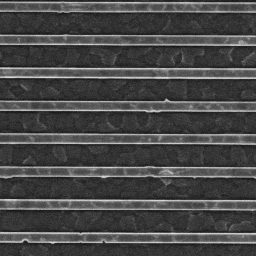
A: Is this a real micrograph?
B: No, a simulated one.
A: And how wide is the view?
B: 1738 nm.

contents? parallel lines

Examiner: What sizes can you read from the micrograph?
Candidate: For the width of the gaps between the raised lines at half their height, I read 157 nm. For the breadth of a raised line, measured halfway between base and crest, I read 63.7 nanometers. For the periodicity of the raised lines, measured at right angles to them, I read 224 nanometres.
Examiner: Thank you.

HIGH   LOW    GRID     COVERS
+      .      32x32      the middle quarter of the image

................................
++++++++++++++++++++++++++++++++
++++++++++++++++++++++++++++++++
................................
................................
................................
................................
................................
................................
+++++++++++++++++++++....++.....
++++++++++++++++++++++++++++++++
................++++++++++++++++
................................
................................
................................
................................
................................
................................
++++++++++++++++++++++++++++++++
++++++++++++++++++++++++++++++++
................................
................................
................................
................................
................................
................................
++++++++++++++++++++++++++++++++
++++++++++++++++++++++++++++++++
................................
................................
................................
................................